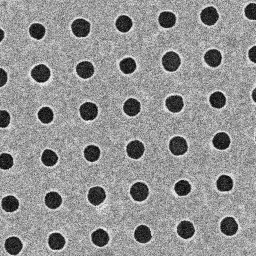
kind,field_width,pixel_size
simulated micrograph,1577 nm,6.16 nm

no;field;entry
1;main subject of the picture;a regular array of holes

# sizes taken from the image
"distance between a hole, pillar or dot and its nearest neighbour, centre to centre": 259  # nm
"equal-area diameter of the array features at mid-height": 113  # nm